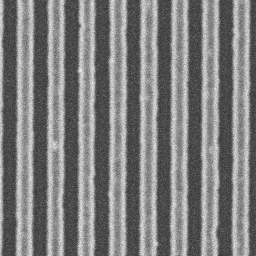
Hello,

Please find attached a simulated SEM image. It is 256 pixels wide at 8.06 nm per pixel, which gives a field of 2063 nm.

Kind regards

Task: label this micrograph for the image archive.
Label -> parallel lines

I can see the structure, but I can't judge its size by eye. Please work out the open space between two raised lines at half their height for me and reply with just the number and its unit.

151 nm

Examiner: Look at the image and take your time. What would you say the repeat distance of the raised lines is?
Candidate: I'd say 249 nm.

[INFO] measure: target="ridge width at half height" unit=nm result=101